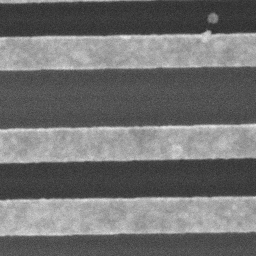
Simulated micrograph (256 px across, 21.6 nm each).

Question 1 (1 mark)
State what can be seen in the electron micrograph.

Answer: lines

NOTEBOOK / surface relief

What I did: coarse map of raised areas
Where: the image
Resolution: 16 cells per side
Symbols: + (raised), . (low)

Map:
................
................
++++++++++++++++
++++++++++++++++
................
................
................
................
++++++++++++++++
++++++++++++++++
................
................
++++++++++++++++
++++++++++++++++
+++++++++++.....
................